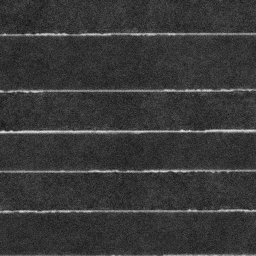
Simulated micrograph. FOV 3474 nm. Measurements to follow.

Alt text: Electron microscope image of lines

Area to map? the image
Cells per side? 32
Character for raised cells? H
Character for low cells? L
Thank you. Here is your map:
LLLLLLLLLLLLLLLLLLLLLLLLLLLLLLLL
LLLLLLLLLLLLLLLLLLLLLLLLLLLLLLLL
LLLLLLLLLLLLLLLLLLLLLLLLLLLLLLLL
LLLLLLLLLLLLLLLLLLLLLLLLLLLLLLLL
HHHHHHHHHHHHHHHHHHHHHHHHHHHHHHHH
HHHHHHHHHHHHHHHHHHHHHHHHHHHHHHHH
HHHHHHHHHHHHHHHHHHHHHHHHHHHHHHHH
HHHHHHHHHHHHHHHHHHHHHHHHHHHHHHHH
HHHHHHHHHHHHHHHHHHHHHHHHHHHHHHHH
HHHHHHHHHHHHHHHHHHHHHHHHHHHHHHHH
HHHHHHHHHHHHHHHHHHHHHHHHHHHHHHHH
LLLLLLLLLLLLLLLLLLLLLLLLLLLLLLLL
LLLLLLLLLLLLLLLLLLLLLLLLLLLLLLLL
LLLLLLLLLLLLLLLLLLLLLLLLLLLLLLLL
LLLLLLLLLLLLLLLLLLLLLLLLLLLLLLLL
LLLLLLLLLLLLLLLLLLLLLLLLLLLLLLLL
HHHHHHHHHHHHHHHHHHHHHHHHHHHHHHHH
HHHHHHHHHHHHHHHHHHHHHHHHHHHHHHHH
HHHHHHHHHHHHHHHHHHHHHHHHHHHHHHHH
HHHHHHHHHHHHHHHHHHHHHHHHHHHHHHHH
HHHHHHHHHHHHHHHHHHHHHHHHHHHHHHHH
LLLLLLLLLLLLLLLLLLLLLLLLLLLLLLLL
LLLLLLLLLLLLLLLLLLLLLLLLLLLLLLLL
LLLLLLLLLLLLLLLLLLLLLLLLLLLLLLLL
LLLLLLLLLLLLLLLLLLLLLLLLLLLLLLLL
LLLLLLLLLLLLLLLLLLLLLLLLLLLLLLLL
HHHHHHHHHHHHHHHHHHHHHHHHHHHHHHHH
HHHHHHHHHHHHHHHHHHHHHHHHHHHHHHHH
HHHHHHHHHHHHHHHHHHHHHHHHHHHHHHHH
HHHHHHHHHHHHHHHHHHHHHHHHHHHHHHHH
HHHHHHHHHHHHHHHHHHHHHHHHHHHHHHHH
HHHHHHHHHHHHHHHHHHHHHHHHHHHHHHHH